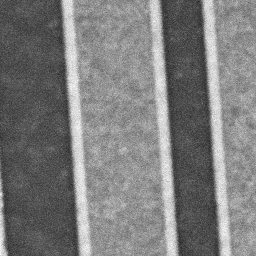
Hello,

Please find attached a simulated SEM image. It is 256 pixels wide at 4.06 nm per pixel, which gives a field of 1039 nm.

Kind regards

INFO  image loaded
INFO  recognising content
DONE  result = one or a few lines or trenches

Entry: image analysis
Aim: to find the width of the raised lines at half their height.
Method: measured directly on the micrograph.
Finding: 0.348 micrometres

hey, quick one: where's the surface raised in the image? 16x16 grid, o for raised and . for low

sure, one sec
....oooooo...ooo
....oooooo...ooo
....oooooo...ooo
.....ooooo...ooo
.....ooooo...ooo
.....ooooo...ooo
.....ooooo...ooo
.....ooooo....oo
.....ooooo....oo
.....ooooo....oo
.....ooooo....oo
.....ooooo....oo
.....oooooo...oo
.....oooooo...oo
.....oooooo...oo
.....oooooo...oo